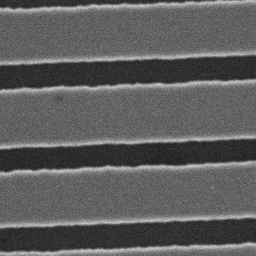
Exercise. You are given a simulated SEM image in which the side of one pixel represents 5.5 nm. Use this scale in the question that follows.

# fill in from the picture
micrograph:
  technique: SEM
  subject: lines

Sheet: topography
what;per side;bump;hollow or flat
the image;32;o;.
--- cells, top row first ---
....................oooooooooooo
oooooooooooooooooooooooooooooooo
oooooooooooooooooooooooooooooooo
oooooooooooooooooooooooooooooooo
oooooooooooooooooooooooooooooooo
oooooooooooooooooooooooooooooooo
oooooooooooooooooooooooooooooooo
ooooooooooooooo.................
................................
................................
.................o.ooooooooooooo
oooooooooooooooooooooooooooooooo
oooooooooooooooooooooooooooooooo
oooooooooooooooooooooooooooooooo
oooooooooooooooooooooooooooooooo
oooooooooooooooooooooooooooooooo
oooooooooooooooooooooooooooooooo
oooooooooooooooooooooooooooo....
oo..............................
................................
..........................oooooo
.ooooooooooooooooooooooooooooooo
oooooooooooooooooooooooooooooooo
oooooooooooooooooooooooooooooooo
oooooooooooooooooooooooooooooooo
oooooooooooooooooooooooooooooooo
oooooooooooooooooooooooooooooooo
oooooooooooooooooooooooo........
................................
................................
..............................oo
.......ooooooooooooooooooooooooo